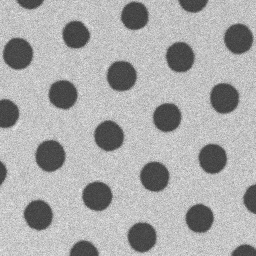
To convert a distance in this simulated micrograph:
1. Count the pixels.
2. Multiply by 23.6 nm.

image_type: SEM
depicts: a regular array of holes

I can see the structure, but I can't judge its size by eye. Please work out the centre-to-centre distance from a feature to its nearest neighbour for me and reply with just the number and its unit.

1430 nm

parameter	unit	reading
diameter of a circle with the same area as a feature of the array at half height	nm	701